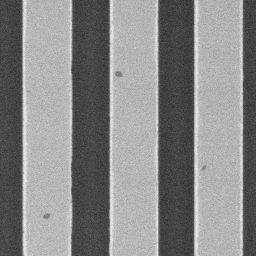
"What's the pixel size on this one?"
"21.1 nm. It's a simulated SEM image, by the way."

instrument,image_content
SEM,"lines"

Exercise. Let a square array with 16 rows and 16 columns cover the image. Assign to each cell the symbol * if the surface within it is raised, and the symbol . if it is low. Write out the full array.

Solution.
.***...***..***.
.***...***..***.
.***...***..***.
.***...***..***.
.***...***..***.
.***...***..***.
.***...***..***.
.***...***..***.
.***...***..***.
.***...***..***.
.***...***..***.
.***...***..***.
.***...***..***.
.***...***..***.
.***...***..***.
.***...***..***.